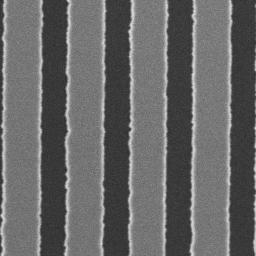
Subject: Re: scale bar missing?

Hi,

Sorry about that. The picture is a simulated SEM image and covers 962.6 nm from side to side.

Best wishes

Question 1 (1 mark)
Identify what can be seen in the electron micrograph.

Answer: lines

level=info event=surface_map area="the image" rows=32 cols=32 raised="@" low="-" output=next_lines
@@@@@---@@@@@---@@@@@---@@@@@---
@@@@@---@@@@@---@@@@@---@@@@@---
@@@@@---@@@@@---@@@@@---@@@@@---
-@@@@---@@@@@---@@@@@---@@@@@---
@@@@@---@@@@@---@@@@@---@@@@@---
@@@@@---@@@@@---@@@@@---@@@@@---
@@@@@---@@@@@---@@@@@---@@@@@---
@@@@@---@@@@@---@@@@@---@@@@@---
@@@@@---@@@@@---@@@@@---@@@@@---
@@@@@---@@@@@---@@@@@---@@@@@---
@@@@@---@@@@@---@@@@@---@@@@@---
@@@@@---@@@@@---@@@@@---@@@@@---
@@@@@---@@@@@---@@@@@---@@@@@---
@@@@@---@@@@@---@@@@@---@@@@@---
@@@@@---@@@@@---@@@@@---@@@@@---
@@@@@---@@@@@---@@@@@---@@@@@---
@@@@@---@@@@@---@@@@@---@@@@@---
@@@@@---@@@@@---@@@@@---@@@@@---
@@@@@---@@@@@---@@@@@---@@@@@---
@@@@@---@@@@@---@@@@@---@@@@@---
@@@@@---@@@@@---@@@@@---@@@@@---
@@@@@---@@@@@---@@@@@---@@@@@---
@@@@@---@@@@@---@@@@@---@@@@@---
@@@@@---@@@@@---@@@@@---@@@@@---
@@@@@---@@@@@---@@@@@---@@@@@---
@@@@@---@@@@@---@@@@@---@@@@@---
@@@@@---@@@@@---@@@@@---@@@@@---
@@@@@---@@@@@---@@@@@---@@@@@---
@@@@@---@@@@@---@@@@@---@@@@@---
@@@@@---@@@@@---@@@@@---@@@@@---
@@@@@---@@@@@---@@@@@---@@@@@---
@@@@@---@@@@@---@@@@@---@@@@@---